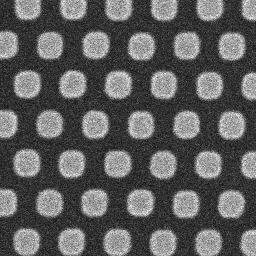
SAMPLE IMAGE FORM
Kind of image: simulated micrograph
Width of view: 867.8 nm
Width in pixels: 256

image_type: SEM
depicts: a regular array of raised bodies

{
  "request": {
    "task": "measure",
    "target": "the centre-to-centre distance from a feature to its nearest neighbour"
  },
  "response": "0.153 microns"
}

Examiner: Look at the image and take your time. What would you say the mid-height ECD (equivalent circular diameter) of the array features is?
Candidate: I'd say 88.5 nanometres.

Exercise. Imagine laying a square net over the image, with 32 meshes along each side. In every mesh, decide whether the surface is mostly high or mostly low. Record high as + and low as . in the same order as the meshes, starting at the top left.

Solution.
..+++...+++..+++...+++...+++..++
..+++...+++..+++...+++...+++..++
................................
................................
++...++....++....++...++....++..
++...+++...+++..+++...+++...++..
++...+++...++...+++...+++...++..
................................
................................
..+++...++....++...+++...++....+
..+++...+++..+++...+++...+++..++
..+++...++...+++...+++...+++..++
................................
................................
++...+++...++...+++...+++...++..
++...+++..+++...+++...+++..+++..
++...+++..+++...+++...+++...++..
................................
................................
..+++...++...+++...+++...++....+
..+++..+++...+++...+++...+++..++
..+++...++...+++...+++...++...++
................................
................................
++...++...+++...+++...++....++..
++...+++..+++...+++...+++..+++..
++...++....++...+++...+++...++..
................................
................................
..+++...++...+++...+++...++....+
..+++...++...+++...+++...+++..++
..++....++....++...+++...++....+